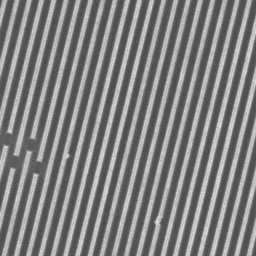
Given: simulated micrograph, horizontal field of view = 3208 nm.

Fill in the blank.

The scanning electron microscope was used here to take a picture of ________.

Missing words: parallel lines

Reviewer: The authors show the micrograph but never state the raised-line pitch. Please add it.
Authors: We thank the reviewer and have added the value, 149 nm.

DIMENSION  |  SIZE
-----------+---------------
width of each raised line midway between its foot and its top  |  68.5 nm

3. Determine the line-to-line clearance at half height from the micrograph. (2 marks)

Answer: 80.6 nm